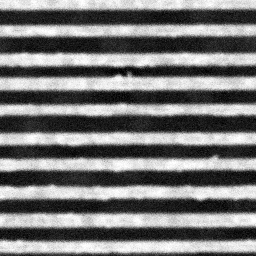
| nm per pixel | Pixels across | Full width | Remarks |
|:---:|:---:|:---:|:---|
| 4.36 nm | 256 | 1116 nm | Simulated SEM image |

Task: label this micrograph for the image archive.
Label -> parallel lines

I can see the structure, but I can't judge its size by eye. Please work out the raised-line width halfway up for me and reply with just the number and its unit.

42.5 nm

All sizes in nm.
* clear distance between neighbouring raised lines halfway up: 76.8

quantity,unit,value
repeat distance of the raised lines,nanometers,118